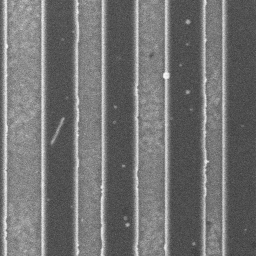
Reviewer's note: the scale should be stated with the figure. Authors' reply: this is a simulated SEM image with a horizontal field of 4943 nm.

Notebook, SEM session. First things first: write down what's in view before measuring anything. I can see lines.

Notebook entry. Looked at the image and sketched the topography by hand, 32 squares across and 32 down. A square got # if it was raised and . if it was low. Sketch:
#....#####...####....#####..####
#....#####...####....#####..####
#....#####...####....#####..####
#....#####...####....#####..####
#....#####...####....#####..####
#....#####...####....#####..####
#....#####...####....#####..####
#....#####...####....#####..####
#....#####...####....#####..####
#....#####...####....#####..####
#....#####...####....#####..####
#....#####...####....#####..####
#....#####...####....#####..####
#....#####...####....#####..####
#....#####...####....#####..####
#....#####...####....#####..####
#....#####...####....#####..####
#....#####...####....#####..####
#....#####...####....#####..####
#....#####...####....#####..####
#....#####...####....#####..####
#....#####...####....#####..####
#....#####...####....#####..####
#....#####...####....#####..####
#....#####...####....#####..####
#....#####...####....#####..####
#....#####...####....#####..####
#....#####...####....#####..####
#....#####...####....#####..####
#....#####...####....#####..####
#....#####...####....#####..####
#....#####...####....#####..####